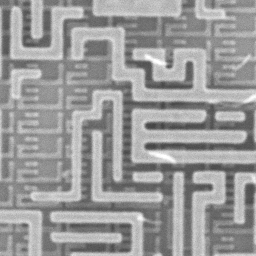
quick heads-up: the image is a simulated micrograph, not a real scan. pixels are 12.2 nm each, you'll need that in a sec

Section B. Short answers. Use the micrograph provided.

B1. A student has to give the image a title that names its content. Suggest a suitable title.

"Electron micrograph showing wiring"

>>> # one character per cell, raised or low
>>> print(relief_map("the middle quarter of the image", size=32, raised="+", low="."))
............+++.......+++..+++..
............++++++++..++++++++..
............++++++++..++++++++..
............++++++++..++++++++..
.................+++............
.................+++............
.................+++++++++++++++
.......++++++++..+++++++++++++++
.......++++++++..+++++++++++++++
.......+++..++..................
.......++...+++.................
.......++...+++..+++++..........
..+++++++....+...+++++++++++++++
..+++++++...++...+++++++++++++++
..++........++...+++............
..++........++...+++............
..++........++...++++...........
..++...++...++...+++++++++++++++
..++...++...++...+++++++++++++++
..++...++...++...++++...........
..++...++...++...+++............
..++...++...++...+++............
..++...++...++...+++++++++++++++
..++...++...++...+++++++++++++++
..++...++...++.....++....+++++++
..++...++...++..................
..++...++...++..................
..++...++...++...+++++++....++..
..++...++...++...++++++++...++..
..++...++...................++..
..++...++...................++..
..++...+++..................++..